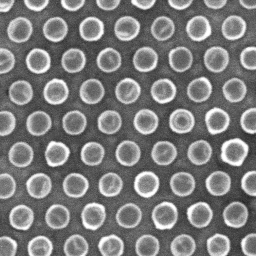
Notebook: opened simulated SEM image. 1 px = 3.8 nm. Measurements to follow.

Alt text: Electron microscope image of a regular array of raised bodies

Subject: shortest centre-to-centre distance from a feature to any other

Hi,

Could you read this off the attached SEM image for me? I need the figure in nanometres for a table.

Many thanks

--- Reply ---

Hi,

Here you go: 134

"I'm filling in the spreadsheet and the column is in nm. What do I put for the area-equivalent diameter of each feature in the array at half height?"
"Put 90.1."